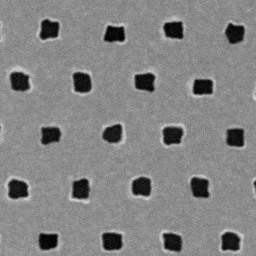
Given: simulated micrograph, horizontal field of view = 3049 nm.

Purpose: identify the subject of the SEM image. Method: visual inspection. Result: a regular array of holes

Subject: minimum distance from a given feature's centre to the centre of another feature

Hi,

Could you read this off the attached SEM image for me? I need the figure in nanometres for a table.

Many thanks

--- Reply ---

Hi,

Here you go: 707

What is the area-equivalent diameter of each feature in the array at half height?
249 nm